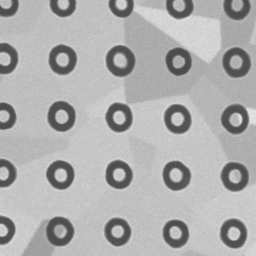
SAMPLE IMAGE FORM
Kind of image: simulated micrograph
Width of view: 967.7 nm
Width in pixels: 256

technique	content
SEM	a regular array of ring-shaped grooves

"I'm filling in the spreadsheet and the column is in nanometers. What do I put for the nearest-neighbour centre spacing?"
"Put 214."